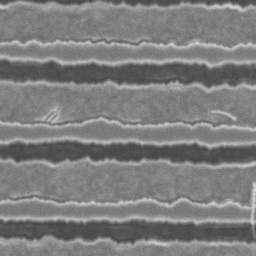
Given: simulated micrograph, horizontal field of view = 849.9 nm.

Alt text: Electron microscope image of lines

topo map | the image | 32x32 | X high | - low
-XXXXXX----XXX--------XX----X---
XXXXXXXXXXXXXXXXXXXXXXXXXXXXXXXX
XXXXXXXXXXXXXXXXXXXXXXXXXXXXXXXX
XXXXXXXXXXXXXXXXXXXXXXXXXXXXXXXX
XXXXXXXXXXXXXXXXXXXXXXXXXXXXXXXX
XXXXXXXXXXXXXXXXXXXXXXXXXXXXXXXX
XXXXXXXXXXXXXXXXXXXXXXXXXXXXXXXX
--XXXX-XXXXXXXXXXXXXXXXXXXXXXXXX
--------------------------------
--------------------------------
XXXXXXXXX----X-------X----------
XXXXXXXXXXXXXXXXXXXXXXXXXXXXXXXX
XXXXXXXXXXXXXXXXXXXXXXXXXXXXXXXX
XXXXXXXXXXXXXXXXXXXXXXXXXXXXXXXX
XXXXXXXXXXXXXXXXXXXXXXXXXXXXXXXX
XXXXXXXXXXXXXXXXXXXXXXXXXXXXXXXX
XXXXXXXXXXXXXXXXXXXXXXXXXXXXXXXX
XXXXXXXX-XXXXXXXXXXXXXXXXXXXXXXX
--------------------------------
--------------------------------
XXXXXXXXXXXXXXXXXXXXXXXX-X--XXXX
XXXXXXXXXXXXXXXXXXXXXXXXXXXXXXXX
XXXXXXXXXXXXXXXXXXXXXXXXXXXXXXXX
XXXXXXXXXXXXXXXXXXXXXXXXXXXXXXXX
XXXXXXXXXXXXXXXXXXXXXXXXXXXXXXXX
XXXXXXXXXXXXXXXXXXXXXXXXXXXXXXXX
XXXXXXXXXXXXXXXXXXXXXXXXXXXXXXXX
----XX--XXX--XXX--XXXXXXXXXXXXXX
--------------------------------
--------------------------------
XXXXXXXXXXXXXXXX-XXXXXXXXXXXXXXX
XXXXXXXXXXXXXXXXXXXXXXXXXXXXXXXX